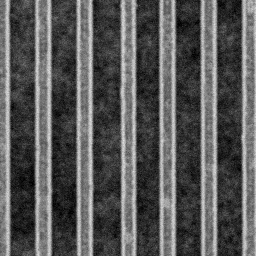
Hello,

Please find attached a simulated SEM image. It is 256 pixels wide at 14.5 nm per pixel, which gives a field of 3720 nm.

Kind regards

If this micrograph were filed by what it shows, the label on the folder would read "parallel lines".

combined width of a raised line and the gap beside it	601	nanometres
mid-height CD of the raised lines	154	nm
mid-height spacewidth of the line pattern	447	nanometers